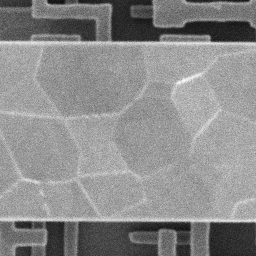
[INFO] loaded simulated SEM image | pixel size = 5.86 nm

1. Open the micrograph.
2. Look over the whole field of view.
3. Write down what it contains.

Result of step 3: wiring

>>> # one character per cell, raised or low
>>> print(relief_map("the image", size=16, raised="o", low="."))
................
................
................
oooooooooooooooo
oooooooooooooooo
oooooooooooooooo
oooooooooooooooo
oooooooooooooooo
oooooooooooooooo
oooooooooooooooo
oooooooooooooooo
oooooooooooooooo
oooooooooooooooo
oooooooooooooooo
................
................